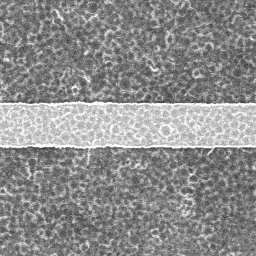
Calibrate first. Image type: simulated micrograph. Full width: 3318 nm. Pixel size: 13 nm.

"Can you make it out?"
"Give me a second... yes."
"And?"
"one or a few lines or trenches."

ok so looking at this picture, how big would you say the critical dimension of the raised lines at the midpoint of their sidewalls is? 559 nanometers